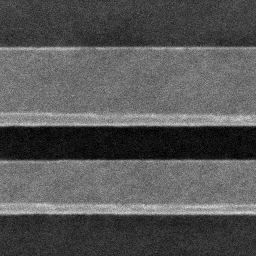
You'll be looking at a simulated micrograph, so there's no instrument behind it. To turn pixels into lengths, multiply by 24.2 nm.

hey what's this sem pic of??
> lines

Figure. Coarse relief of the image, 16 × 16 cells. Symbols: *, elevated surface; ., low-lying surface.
................
................
................
****************
****************
****************
****************
****************
................
................
****************
****************
****************
................
................
................